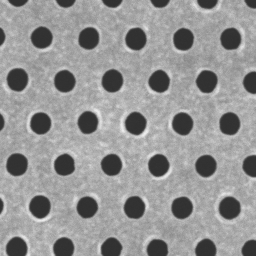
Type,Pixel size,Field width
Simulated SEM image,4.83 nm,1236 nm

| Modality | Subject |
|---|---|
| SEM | a regular array of holes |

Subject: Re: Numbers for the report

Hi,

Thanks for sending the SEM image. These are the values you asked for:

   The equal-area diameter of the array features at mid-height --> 21.8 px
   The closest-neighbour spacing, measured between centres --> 47.3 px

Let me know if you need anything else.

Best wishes